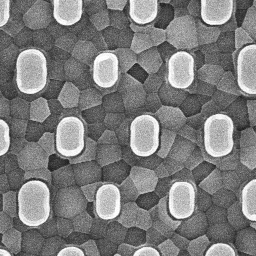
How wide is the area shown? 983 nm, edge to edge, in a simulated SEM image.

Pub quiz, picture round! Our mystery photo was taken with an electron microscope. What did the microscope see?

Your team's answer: a regular array of raised bodies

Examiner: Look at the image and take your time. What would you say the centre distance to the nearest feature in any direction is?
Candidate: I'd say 285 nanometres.